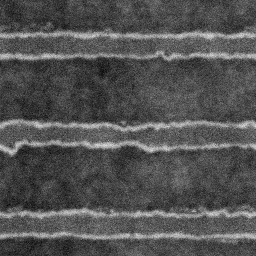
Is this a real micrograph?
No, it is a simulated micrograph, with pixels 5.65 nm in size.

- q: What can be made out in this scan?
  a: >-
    one or a few lines or trenches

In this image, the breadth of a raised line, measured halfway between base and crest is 23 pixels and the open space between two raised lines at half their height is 378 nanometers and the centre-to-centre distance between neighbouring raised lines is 89.7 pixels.